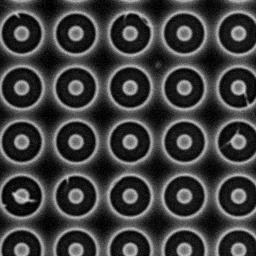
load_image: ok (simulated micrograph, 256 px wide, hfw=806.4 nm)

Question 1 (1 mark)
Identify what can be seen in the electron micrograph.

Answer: an array of small figures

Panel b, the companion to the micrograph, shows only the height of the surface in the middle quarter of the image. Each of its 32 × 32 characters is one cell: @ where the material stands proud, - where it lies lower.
@@@@@@@@@@@@@@@@@@@@@@@@@@@@@@@@
------@@@@@@@@-----@@@@@@@@@----
-------@@@@@@-------@@@@@@------
--------@@@@---------@@@@@------
--@@----@@@-----@-----@@@----@@-
-@@@----@@@----@@@----@@@----@@@
-@@@----@@@----@@@----@@@----@@@
--------@@@@----@----@@@@-----@-
--------@@@@---------@@@@@------
-------@@@@@@-------@@@@@@------
------@@@@@@@@-----@@@@@@@@@----
@@@@@@@@@@@@@@@@@@@@@@@@@@@@@@@@
@@@@@@@@@@@@@@@@@@@@@@@@@@@@@@@@
@@@@@@@@@@@@@@@@@@@@@@@@@@@@@@@@
@----@@@@@@@@@@---@@@@@@@@@@----
------@@@@@@@-------@@@@@@@-----
-------@@@@@---------@@@@@------
--------@@@@---------@@@@-------
--@@----@@@----@@@----@@@----@@-
-@@@----@@@----@@@----@@@----@@@
--@@----@@@----@@@----@@@----@@-
--------@@@@---------@@@@-------
-------@@@@@---------@@@@@------
------@@@@@@@------@@@@@@@@-----
@----@@@@@@@@@@---@@@@@@@@@@@---
@@@@@@@@@@@@@@@@@@@@@@@@@@@@@@@@
@@@@@@@@@@@@@@@@@@@@@@@@@@@@@@@@
@@@@@@@@@@@@@@@@@@@@@@@@@@@@@@@@
@-----@@@@@@@@-----@@@@@@@@-----
-------@@@@@@-------@@@@@@------
--------@@@@---------@@@@@------
--------@@@@----@-----@@@-----@-